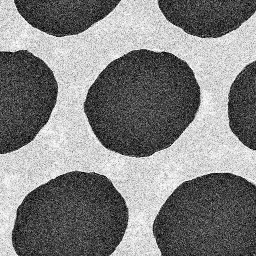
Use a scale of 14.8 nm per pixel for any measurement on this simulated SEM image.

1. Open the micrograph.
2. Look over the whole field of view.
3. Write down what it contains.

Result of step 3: holes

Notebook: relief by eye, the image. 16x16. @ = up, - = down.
@------@@@------
@@----@@@@@----@
@@@@@@@@@@@@@@@@
--@@@@@@---@@@@@
---@@@------@@@-
----@@------@@--
---@@-------@@--
---@@-------@@--
--@@@@-----@@@@-
-@@@@@@---@@@@@@
@@@@@@@@@@@@@@@@
@@@----@@@@-----
@-------@@------
@-------@@------
@-------@@------
@------@@@------